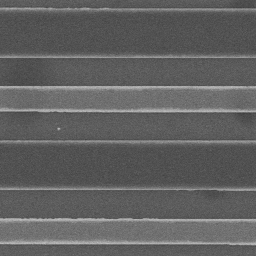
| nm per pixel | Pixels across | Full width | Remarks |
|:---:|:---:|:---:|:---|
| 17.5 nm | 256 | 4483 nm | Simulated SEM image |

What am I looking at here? lines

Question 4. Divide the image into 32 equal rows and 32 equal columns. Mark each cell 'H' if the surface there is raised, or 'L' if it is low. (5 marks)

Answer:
LLLLLLLLLLLLLLLLLLLLLLLLLLLLLLLL
HHHHHHHHHHHHHHHHHHHHHHHHHHHHHHHH
HHHHHHHHHHHHHHHHHHHHHHHHHHHHHHHH
HHHHHHHHHHHHHHHHHHHHHHHHHHHHHHHH
HHHHHHHHHHHHHHHHHHHHHHHHHHHHHHHH
HHHHHHHHHHHHHHHHHHHHHHHHHHHHHHHH
HHHHHHHHHHHHHHHHHHHHHHHHHHHHHHHH
LLLLLLLLLLLLLLLLLLLLLLLLLLLLLLLL
LLLLLLLLLLLLLLLLLLLLLLLLLLLLLLLL
LLLLLLLLLLLLLLLLLLLLLLLLLLLLLLLL
LLLLLLLLLLLLLLLLLLLLLLLLLLLLLLLL
HHHHHHHHHHHHHHHHHHHHHHHHHHHHHHHH
HHHHHHHHHHHHHHHHHHHHHHHHHHHHHHHH
HHHHHHHHHHHHHHHHHHHHHHHHHHHHHHHH
LLLLLLLLLLLLLLLLLLLLLLLLLLLLLLLL
LLLLLLLLLLLLLLLLLLLLLLLLLLLLLLLL
LLLLLLLLLLLLLLLLLLLLLLLLLLLLLLLL
LLLLLLLLLLLLLLLLLLLLLLLLLLLLLLLL
HHHHHHHHHHHHHHHHHHHHHHHHHHHHHHHH
HHHHHHHHHHHHHHHHHHHHHHHHHHHHHHHH
HHHHHHHHHHHHHHHHHHHHHHHHHHHHHHHH
HHHHHHHHHHHHHHHHHHHHHHHHHHHHHHHH
HHHHHHHHHHHHHHHHHHHHHHHHHHHHHHHH
HHHHHHHHHHHHHHHHHHHHHHHHHHHHHHHH
LLLLLLLLLLLLLLLLLLLLLLLLLLLLLLLL
LLLLLLLLLLLLLLLLLLLLLLLLLLLLLLLL
LLLLLLLLLLLLLLLLLLLLLLLLLLLLLLLL
HHHHHHHHHHHHHHHHHHHHHHHHHHHHHHHH
HHHHHHHHHHHHHHHHHHHHHHHHHHHHHHHH
HHHHHHHHHHHHHHHHHHHHHHHHHHHHHHHH
LLLLLLLLLLLLLLLLLLLLLLLLLLLLLLLL
LLLLLLLLLLLLLLLLLLLLLLLLLLLLLLLL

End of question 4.